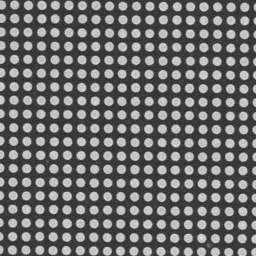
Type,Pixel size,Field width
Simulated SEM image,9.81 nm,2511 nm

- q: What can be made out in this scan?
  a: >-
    a regular array of raised bodies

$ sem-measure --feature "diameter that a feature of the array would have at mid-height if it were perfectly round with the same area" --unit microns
0.0871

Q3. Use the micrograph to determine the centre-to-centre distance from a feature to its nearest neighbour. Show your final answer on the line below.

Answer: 130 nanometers